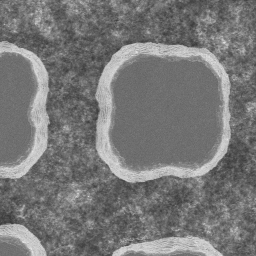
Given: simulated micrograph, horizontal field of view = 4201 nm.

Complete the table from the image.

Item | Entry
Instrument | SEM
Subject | raised bodies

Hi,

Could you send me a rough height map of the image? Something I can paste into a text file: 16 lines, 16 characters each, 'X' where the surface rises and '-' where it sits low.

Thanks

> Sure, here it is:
----------------
----------------
----------------
XX-----XXXXXX---
XX-----XXXXXXX--
XXX----XXXXXXX--
XXX----XXXXXXX--
XXX----XXXXXXX--
XXX---XXXXXXXX--
XX-----XXXXXXX--
XX-----XXXXXX---
----------------
----------------
----------------
X---------------
XX------XXXXX---